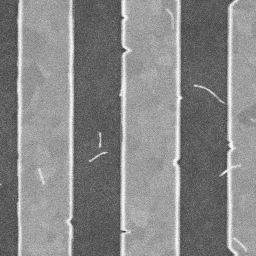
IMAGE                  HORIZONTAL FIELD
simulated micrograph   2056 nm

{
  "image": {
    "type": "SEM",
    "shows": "one or a few lines or trenches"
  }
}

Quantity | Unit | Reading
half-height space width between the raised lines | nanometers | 418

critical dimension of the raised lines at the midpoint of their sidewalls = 0.418 µm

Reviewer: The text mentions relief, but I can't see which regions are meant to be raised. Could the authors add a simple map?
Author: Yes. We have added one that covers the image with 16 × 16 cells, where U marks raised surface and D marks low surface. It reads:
DUUUDDDDUUUDDDUU
DUUUDDDDUUUDDDUU
DUUUDDDDUUUDDDUU
DUUUDDDDUUUDDDUU
DUUUDDDDUUUDDDUU
DUUUDDDDUUUDDDUU
DUUUDDDDUUUDDDUU
DUUUDDDDUUUDDDUU
DUUUDDDDUUUDDDUU
DUUUDDDDUUUDDDUU
DUUUDDDDUUUDDDUU
DUUUDDDDUUUDDDUU
DUUUDDDDUUUDDDUU
DUUUDDDDUUUDDDUU
DUUUDDDDUUUDDDUU
DUUUDDDDUUUDDDUU